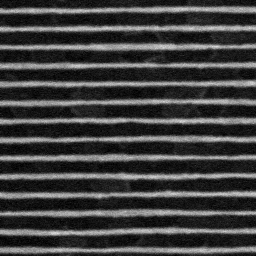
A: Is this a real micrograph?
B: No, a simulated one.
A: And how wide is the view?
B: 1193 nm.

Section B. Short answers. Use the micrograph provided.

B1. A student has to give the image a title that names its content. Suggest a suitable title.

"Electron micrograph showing parallel lines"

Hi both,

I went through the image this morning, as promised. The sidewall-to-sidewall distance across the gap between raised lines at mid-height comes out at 0.0693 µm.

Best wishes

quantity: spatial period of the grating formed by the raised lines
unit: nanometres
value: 85.9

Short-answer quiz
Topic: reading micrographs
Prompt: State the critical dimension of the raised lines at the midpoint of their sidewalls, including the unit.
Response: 19.2 nanometres